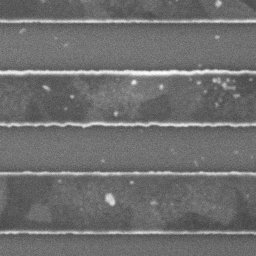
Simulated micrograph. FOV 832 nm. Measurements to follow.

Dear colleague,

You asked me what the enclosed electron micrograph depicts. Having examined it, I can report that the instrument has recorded lines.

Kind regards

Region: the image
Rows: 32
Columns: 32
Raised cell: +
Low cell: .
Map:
++++++++++++++++++++++++++++++++
++++++++++++++++++++++++++++++++
++++++++++++++++++++++++++++++++
................................
................................
................................
................................
................................
................................
++++++++++++++++++++++++++++++++
++++++++++++++++++++++++++++++++
++++++++++++++++++++++++++++++++
++++++++++++++++++++++++++++++++
++++++++++++++++++++++++++++++++
++++++++++++++++++++++++++++++++
++++++++++++++++++++++++++++++++
................................
................................
................................
................................
................................
................................
++++++++++++++++++++++++++++++++
++++++++++++++++++++++++++++++++
++++++++++++++++++++++++++++++++
++++++++++++++++++++++++++++++++
++++++++++++++++++++++++++++++++
++++++++++++++++++++++++++++++++
++++++++++++++++++++++++++++++++
................................
................................
................................